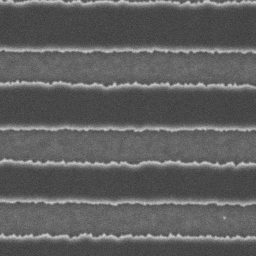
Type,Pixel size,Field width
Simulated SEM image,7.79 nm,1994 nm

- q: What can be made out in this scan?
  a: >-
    lines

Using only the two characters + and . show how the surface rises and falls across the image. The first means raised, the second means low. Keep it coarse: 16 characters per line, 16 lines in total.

++++++++++++++++
++++++++++++++++
++++++++++++++++
................
................
++++++++++++++++
++++++++++++++++
++++++++++++++++
................
................
++++++++++++++++
++++++++++++++++
++++++++++++++++
................
................
++++++++++++++++